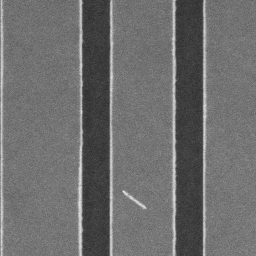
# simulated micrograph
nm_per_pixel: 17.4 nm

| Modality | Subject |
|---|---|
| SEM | lines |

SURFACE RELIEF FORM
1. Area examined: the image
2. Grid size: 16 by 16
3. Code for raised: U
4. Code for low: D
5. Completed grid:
UUUUUDDUUUUDDUUU
UUUUUDDUUUUDDUUU
UUUUUDDUUUUDDUUU
UUUUUDDUUUUDDUUU
UUUUUDDUUUUDDUUU
UUUUUDDUUUUDDUUU
UUUUUDDUUUUDDUUU
UUUUUDDUUUUDDUUU
UUUUUDDUUUUDDUUU
UUUUUDDUUUUDDUUU
UUUUUDDUUUUDDUUU
UUUUUDDUUUUDDUUU
UUUUUDDUUUUDDUUU
UUUUUDDUUUUDDUUU
UUUUUDDUUUUDDUUU
UUUUUDDUUUUDDUUU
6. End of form